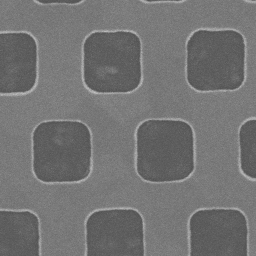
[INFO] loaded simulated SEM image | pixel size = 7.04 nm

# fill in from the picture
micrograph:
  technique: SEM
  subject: holes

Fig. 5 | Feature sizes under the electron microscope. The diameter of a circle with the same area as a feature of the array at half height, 461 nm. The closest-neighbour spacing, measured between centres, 727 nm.